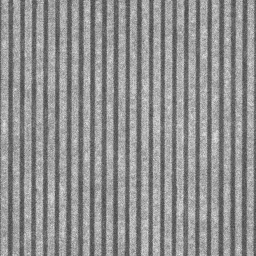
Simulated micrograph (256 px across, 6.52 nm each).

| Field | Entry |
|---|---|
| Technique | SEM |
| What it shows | parallel lines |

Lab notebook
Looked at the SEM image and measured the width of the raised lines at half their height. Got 0.0407 µm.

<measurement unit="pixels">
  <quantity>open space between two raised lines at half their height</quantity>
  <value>5.37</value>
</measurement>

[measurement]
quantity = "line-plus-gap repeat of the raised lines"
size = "76.4 nm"